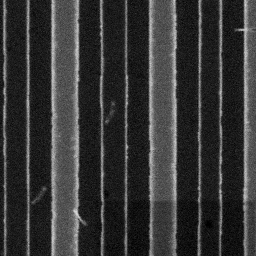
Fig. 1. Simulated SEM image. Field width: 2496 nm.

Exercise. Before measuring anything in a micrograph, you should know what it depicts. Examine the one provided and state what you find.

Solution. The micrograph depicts lines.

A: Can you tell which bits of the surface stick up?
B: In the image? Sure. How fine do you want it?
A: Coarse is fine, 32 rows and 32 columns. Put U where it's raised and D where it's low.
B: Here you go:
DUUUDDDUUUDDDUUUDDDUUUDDDUUUDDDU
DUUUDDDUUUDDDUUUDDDUUUDDDUUUDDDU
DUUDDDDUUUDDDUUUDDDUUUDDDUUUDDDU
DUUDDDDUUUDDDUUUDDDUUUDDDUUUDDDU
DUUUDDDUUUDDDUUUDDDUUUDDDUUUDDDU
DUUUDDDUUUDDDUUUDDDUUUDDDUUUDDDU
DUUUDDDUUUDDDUUUDDDUUUDDDUUUDDDU
DUUUDDDUUUDDDUUUDDDUUUDDDUUUDDDU
DUUUDDDUUUDDDUUUDDDUUUDDDUUUDDDU
DUUUDDDUUUDDDUUUDDDUUUDDDUUUDDDU
DUUUDDDUUUDDDUUUDDDUUUDDDUUUDDDU
DUUUDDDUUUDDDUUUDDDUUUDDDUUUDDDU
DUUDDDDUUUDDDUUUDDDUUUDDDUUUDDDU
DUUDDDDUUUDDDUUUDDDUUUDDDUUUDDDU
DUUUDDDUUUDDDUUUDDDUUUDDDUUUDDDU
DUUUDDDUUUDDDUUUDDDUUUDDDUUUDDDU
DUUUDDDUUUDDDUUUDDDUUUDDDUUUDDDU
DUUUDDDUUUDDDUUUDDDUUUDDDUUUDDDU
DUUUDDDUUUDDDUUUDDDUUUDDDUUUDDDU
DUUUDDDUUUDDDUUUDDDUUUDDDUUUDDDU
DUUUDDDUUUDDDUUUDDDUUUDDDUUUDDDU
DUUUDDDUUUDDDUUUDDDUUUDDDUUUDDDU
DUUUDDDUUUDDDUUUDDDUUUDDDUUUDDDU
DUUUDDDUUUDDDUUUDDDUUUDDDUUUDDDU
DUUUDDDUUUDDDUUUDDDUUUDDDUUUDDDU
DUUUDDDUUUDDDUUUDDDUUUDDDUUUDDDU
DUUUDDDUUUDDDUUUDDDUUUDDDUUUDDDU
DUUUDDDUUUDDDUUUDDDUUUDDDUUUDDDU
DUUUDDDUUUDDDUUUDDDUUUDDDUUUDDDU
DUUUDDDUUUDDDUUUDDDUUUDDDUUUDDDU
DUUUDDDUUUDDDUUUDDDUUUDDDUUUDDDU
DUUUDDDUUUDDDUUUDDDUUUDDDUUUDDDU